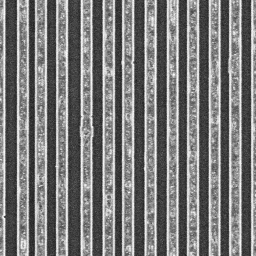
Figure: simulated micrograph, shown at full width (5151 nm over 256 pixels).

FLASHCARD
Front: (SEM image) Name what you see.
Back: parallel lines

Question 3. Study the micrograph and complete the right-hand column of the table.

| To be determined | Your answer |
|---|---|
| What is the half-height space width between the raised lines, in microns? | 0.244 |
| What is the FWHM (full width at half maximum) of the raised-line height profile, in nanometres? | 194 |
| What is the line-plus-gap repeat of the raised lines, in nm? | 427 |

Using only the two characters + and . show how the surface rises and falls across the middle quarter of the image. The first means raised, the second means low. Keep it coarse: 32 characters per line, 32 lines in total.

+...+++...++...++....++...++...+
+...+++...++...++....++...++...+
+...+++...++...++....++...++...+
+...+++...++...++....++...++...+
+...+++...++...++....++...++...+
+...+++...++...++....++...++...+
+...+++...++...++....++...++...+
+...+++...++...++....++...++...+
+...+++...++...++....++...++...+
+...+++...++...++....++...++...+
+...+++...++...++....++...++...+
+...+++...++...++....++...++...+
+...+++...++...++....++...++...+
+...+++...++...++....++...++...+
+...+++...++...++....++...++...+
+...+++...++...++....++...++...+
+...+++...++...++....++...++...+
+...+++...++...++....++...++...+
+...+++...++...++....++...++...+
+...+++...++...++....++...++...+
+...+++...++...++....++...++...+
+...+++...++...++....++...++...+
+...+++...++...++....++...++...+
+...+++...++...++....++...++...+
+...+++...++...++....++...++...+
+...+++...++...++....++...++...+
+...+++...++...++...+++...++...+
+...+++...++...++....++...++...+
+...+++...++...++....++...++...+
+...+++...++...++....++...++...+
+...+++...++...++....++...++...+
+...+++...++...++....++...++...+